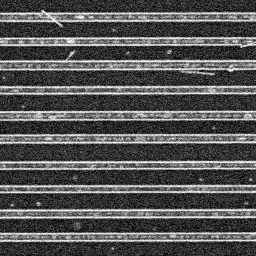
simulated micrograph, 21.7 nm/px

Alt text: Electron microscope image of parallel lines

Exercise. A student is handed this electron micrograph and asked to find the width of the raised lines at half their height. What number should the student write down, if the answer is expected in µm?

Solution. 0.149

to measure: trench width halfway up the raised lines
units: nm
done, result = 382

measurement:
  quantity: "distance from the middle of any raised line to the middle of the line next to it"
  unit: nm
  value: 529